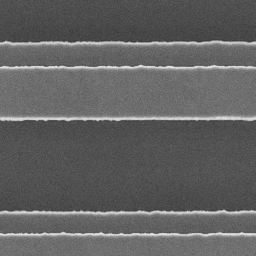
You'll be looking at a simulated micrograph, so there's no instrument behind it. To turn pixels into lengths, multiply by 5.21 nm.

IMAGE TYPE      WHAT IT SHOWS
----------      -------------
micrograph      lines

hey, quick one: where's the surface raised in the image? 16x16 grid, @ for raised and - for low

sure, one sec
----------------
----------------
----------------
@@@@@@@@@@@@@@@@
@@@@@@@@@@@@@@@@
@@@@@@@@@@@@@@@@
@@@@@@@@@@@@@@@@
----------------
----------------
----------------
----------------
----------------
----------------
@@@@@@@@@@@@@@@@
@@@@@@@@@@@@@@@@
@@@@@@@@@@@@@@@@